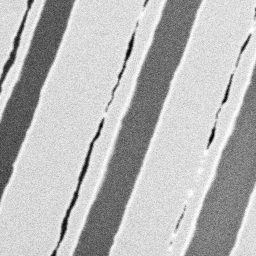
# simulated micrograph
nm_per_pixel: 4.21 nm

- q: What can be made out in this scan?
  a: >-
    lines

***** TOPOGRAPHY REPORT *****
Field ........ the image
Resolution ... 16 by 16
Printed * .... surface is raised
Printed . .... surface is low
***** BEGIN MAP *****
***..*****...***
**..******..****
**..*****...****
**..*****..*****
*..******..*****
*..*****...****.
..******..*****.
..******..*****.
..*****...****..
.******..*****..
.******..****...
.*****...****...
******..*****...
*****...****...*
*****..*****...*
*****..*****...*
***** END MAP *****